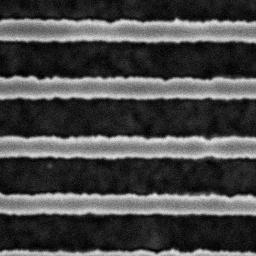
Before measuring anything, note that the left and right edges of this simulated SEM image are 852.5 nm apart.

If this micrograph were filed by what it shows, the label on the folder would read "lines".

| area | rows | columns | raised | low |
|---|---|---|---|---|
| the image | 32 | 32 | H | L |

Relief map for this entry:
LLLLLLLLLLLLLLLLLLLLLLLLLLLLLLLL
LLLLLLLLLLLLLLLLLLLLLLLLLLLLLLLL
HHHHHLHHHLHHLLLHLLLLLLHLLLLLLLLL
HHHHHHHHHHHHHHHHHHHHHHHHHHHHHHHH
HHHHHHHHHHHHHHHHHHHHHHHHHHHHHHHH
LLLLLLLLLLLLLLLLLLLLLLLLLLLLLLLL
LLLLLLLLLLLLLLLLLLLLLLLLLLLLLLLL
LLLLLLLLLLLLLLLLLLLLLLLLLLLLLLLL
LLLLLLLLLLLLLLLLLLLLLLLLLLLLLLLL
LLLLLLLLLLLLLLLLLLLLLLLLLLLLLLLL
HHHHHHHHHHHHHHHHHHHHHHHHHHHHHHHH
HHHHHHHHHHHHHHHHHHHHHHHHHHHHHHHH
LLLLLLLLLLLLLLLLLLLLLLLLLLLLLLLL
LLLLLLLLLLLLLLLLLLLLLLLLLLLLLLLL
LLLLLLLLLLLLLLLLLLLLLLLLLLLLLLLL
LLLLLLLLLLLLLLLLLLLLLLLLLLLLLLLL
LLLLLLLLLLLLLLLLLLLLLLLLLLLLLLLL
HHHHHHHHHHHHHHHHHHHHHHHHHHHHHHHH
HHHHHHHHHHHHHHHHHHHHHHHHHHHHHHHH
HHHHHHHHHHHHHHHHHHHHHHHHHHHHHHHH
LLLLLLLLLLLLLLLLLLLLLLLLLLLLLLLL
LLLLLLLLLLLLLLLLLLLLLLLLLLLLLLLL
LLLLLLLLLLLLLLLLLLLLLLLLLLLLLLLL
LLLLLLLLLLLLLLLLLLLLLLLLLLLLLLLL
HHHHHHHHHHHHHHHHHHHHHHHHHHHHLHHH
HHHHHHHHHHHHHHHHHHHHHHHHHHHHHHHH
HHHHHHHHHHHHHHHHHHHHHHHHHHHHHHHH
LLLLLLLLLLLLLLLLLLLLLLLLLLLLLLLL
LLLLLLLLLLLLLLLLLLLLLLLLLLLLLLLL
LLLLLLLLLLLLLLLLLLLLLLLLLLLLLLLL
LLLLLLLLLLLLLLLLLLLLLLLLLLLLLLLL
HHHHHHHHLLLHHHHHHHHLHHHLHHHHHHLL